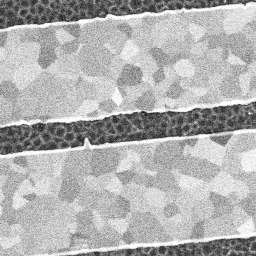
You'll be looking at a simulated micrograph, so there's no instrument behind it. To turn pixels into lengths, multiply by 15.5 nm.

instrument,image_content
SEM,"one or a few lines or trenches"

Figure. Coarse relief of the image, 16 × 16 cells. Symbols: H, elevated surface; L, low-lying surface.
LLLLLLLLLLLLLLHH
LLLHHHHHHHHHHHHH
HHHHHHHHHHHHHHHH
HHHHHHHHHHHHHHHH
HHHHHHHHHHHHHHHH
HHHHHHHHHHHHHHHH
HHHHHHHHHHHHHHLL
HHHHLLLLLLLLLLLL
LLLLLLLLLLLLLHHH
LLLHHHHHHHHHHHHH
HHHHHHHHHHHHHHHH
HHHHHHHHHHHHHHHH
HHHHHHHHHHHHHHHH
HHHHHHHHHHHHHHHH
HHHHHHHHHHHHHHHH
HHHHHHHLLLLLLLLL